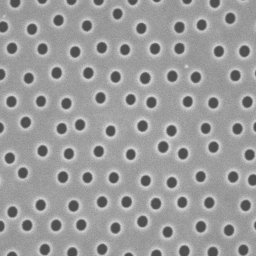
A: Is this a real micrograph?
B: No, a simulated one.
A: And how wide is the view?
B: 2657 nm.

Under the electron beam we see a regular array of holes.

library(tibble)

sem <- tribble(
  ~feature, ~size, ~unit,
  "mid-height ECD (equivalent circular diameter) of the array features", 114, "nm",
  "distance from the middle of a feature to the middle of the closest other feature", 257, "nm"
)